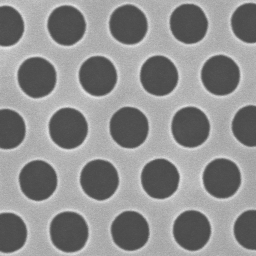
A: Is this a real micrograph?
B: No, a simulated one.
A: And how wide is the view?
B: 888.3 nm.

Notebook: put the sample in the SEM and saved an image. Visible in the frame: a regular array of holes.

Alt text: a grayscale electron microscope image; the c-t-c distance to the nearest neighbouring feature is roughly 208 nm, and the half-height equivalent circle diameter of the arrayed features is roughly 139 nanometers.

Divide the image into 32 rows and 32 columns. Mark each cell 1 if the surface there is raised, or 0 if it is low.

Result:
11111111111111111111111011111100
00111100001111000011110001111000
00011100000111000011100000111000
00011100000111000011100000111000
00011100001111000011110000111000
00111110011111100111111011111111
11111111111111111111111111111111
11100011111000111100011111000111
11000001110000111100001110000011
11000001110000011000001110000011
11000001110000111100001110000011
11100011111000111100011111000111
11111111111111111111111111111111
11111111011111100111111001111100
00011110000111000011110000111000
00011100000111000001100000111000
00011100000111000001100000111000
00011100000111000011110000111100
00111111011111110111111111111111
11111111111111111111111111111111
11100011111000111100001111000111
11000001110000011100001110000011
11000001110000011100001110000011
11100001110000011100001111000011
11100011111000111110011111100111
11111111111111111111111111111111
11111111011111100111111001111100
00011110000111000011110000111000
00011100000111000001110000111000
00011100000111000001110000111000
00011110000111000011110000111100
00111111001111111111111111111111